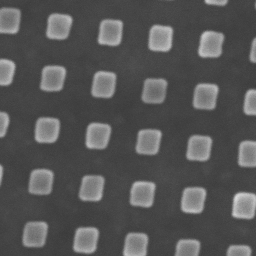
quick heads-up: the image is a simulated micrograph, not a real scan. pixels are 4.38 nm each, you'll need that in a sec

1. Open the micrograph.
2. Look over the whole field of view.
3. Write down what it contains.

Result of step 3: a regular array of raised bodies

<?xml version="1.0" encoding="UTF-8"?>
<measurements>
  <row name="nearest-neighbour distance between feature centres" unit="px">51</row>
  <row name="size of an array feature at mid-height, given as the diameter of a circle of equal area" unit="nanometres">113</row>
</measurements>